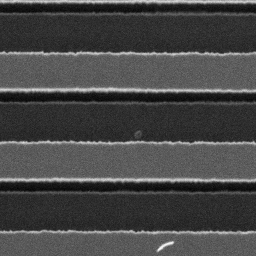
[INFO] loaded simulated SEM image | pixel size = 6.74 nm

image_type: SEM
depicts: lines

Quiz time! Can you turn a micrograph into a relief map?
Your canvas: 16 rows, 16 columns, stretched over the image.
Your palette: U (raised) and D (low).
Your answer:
DDDDDDDDDDDDDDDD
DDDDDDDDDDDDDDDD
DDDDDDDDDDDDDDDD
UUUUUUUUUUUUUUUU
UUUUUUUUUUUUUUUU
UUUUUUUUUUUUUUUU
DDDDDDDDDDDDDDDD
DDDDDDDDDDDDDDDD
DDDDDDDDDDDDDDDD
UUUUUUUUUUUUUUUU
UUUUUUUUUUUUUUUU
DDDDDDDDDDDDDDDD
DDDDDDDDDDDDDDDD
DDDDDDDDDDDDDDDD
UUUUUUUUUUUUUUUU
UUUUUUUUUUUUUUUU